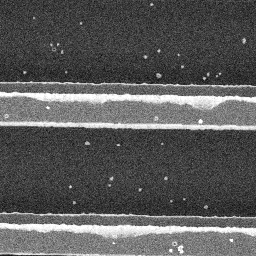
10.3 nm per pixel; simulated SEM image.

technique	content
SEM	lines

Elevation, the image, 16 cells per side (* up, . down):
................
................
................
................
................
****************
****************
****************
................
................
................
................
................
**********......
****************
****************